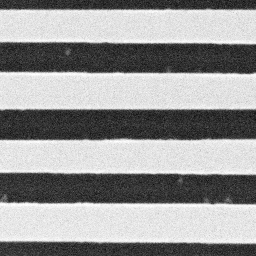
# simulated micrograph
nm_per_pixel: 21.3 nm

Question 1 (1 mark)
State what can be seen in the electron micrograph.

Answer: lines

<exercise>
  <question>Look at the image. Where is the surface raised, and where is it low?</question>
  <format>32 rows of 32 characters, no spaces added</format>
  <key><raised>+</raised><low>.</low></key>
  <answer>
................................
++++++++++++++++++++++++++++++++
++++++++++++++++++++++++++++++++
++++++++++++++++++++++++++++++++
++++++++++++++++++++++++++++++++
................................
................................
................................
................................
++++++++++++++++++++++++++++++++
++++++++++++++++++++++++++++++++
++++++++++++++++++++++++++++++++
++++++++++++++++++++++++++++++++
++++++++++++++++++++++++++++++++
................................
................................
................................
................................
++++++++++++++++++++++++++++++++
++++++++++++++++++++++++++++++++
++++++++++++++++++++++++++++++++
......++++++++++++++++++++++++++
................................
................................
................................
++++.....+++....................
++++++++++++++++++++++++++++++++
++++++++++++++++++++++++++++++++
++++++++++++++++++++++++++++++++
++++++++++++++++++++++++++++++++
................................
................................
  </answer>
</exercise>